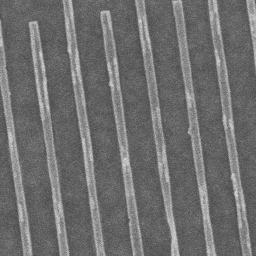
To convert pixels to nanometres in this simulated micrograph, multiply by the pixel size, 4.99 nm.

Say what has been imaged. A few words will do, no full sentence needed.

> parallel lines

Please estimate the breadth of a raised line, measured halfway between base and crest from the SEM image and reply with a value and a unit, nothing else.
40.8 nm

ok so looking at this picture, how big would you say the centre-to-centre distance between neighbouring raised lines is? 36.1 px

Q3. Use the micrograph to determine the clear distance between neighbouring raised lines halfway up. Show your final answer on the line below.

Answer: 141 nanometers